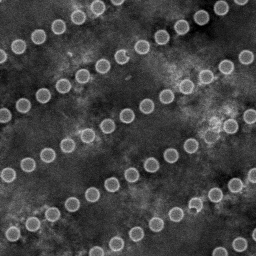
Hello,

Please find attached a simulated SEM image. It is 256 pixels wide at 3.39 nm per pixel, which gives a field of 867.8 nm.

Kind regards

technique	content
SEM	a regular array of raised bodies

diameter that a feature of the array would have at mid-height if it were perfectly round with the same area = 47.4 nanometres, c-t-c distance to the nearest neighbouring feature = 74.3 nm